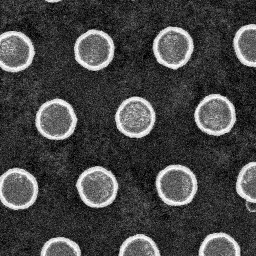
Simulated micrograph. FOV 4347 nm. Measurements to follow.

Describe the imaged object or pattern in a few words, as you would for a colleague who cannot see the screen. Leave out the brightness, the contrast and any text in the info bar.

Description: raised bodies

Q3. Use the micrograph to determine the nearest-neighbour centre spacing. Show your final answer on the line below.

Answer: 1340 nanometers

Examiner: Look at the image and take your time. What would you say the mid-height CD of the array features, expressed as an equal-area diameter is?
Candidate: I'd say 635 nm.